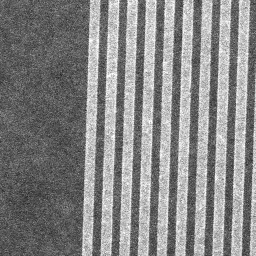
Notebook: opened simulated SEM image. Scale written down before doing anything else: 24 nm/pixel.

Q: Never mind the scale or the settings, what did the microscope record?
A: parallel lines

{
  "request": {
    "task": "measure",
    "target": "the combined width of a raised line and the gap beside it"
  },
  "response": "448 nanometers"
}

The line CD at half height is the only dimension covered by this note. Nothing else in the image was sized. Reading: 231 nm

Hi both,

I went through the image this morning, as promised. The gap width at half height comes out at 0.219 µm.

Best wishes